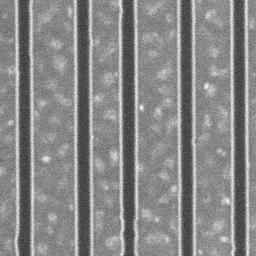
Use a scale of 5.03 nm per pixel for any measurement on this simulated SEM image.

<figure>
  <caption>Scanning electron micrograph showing parallel lines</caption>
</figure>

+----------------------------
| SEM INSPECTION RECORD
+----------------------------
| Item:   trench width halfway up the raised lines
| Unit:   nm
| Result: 191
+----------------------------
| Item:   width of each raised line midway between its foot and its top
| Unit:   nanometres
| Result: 77.3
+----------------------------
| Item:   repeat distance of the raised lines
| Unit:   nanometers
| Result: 270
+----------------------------